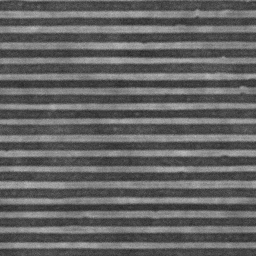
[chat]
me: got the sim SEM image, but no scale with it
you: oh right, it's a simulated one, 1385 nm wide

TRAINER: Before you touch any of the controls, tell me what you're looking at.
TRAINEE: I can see parallel lines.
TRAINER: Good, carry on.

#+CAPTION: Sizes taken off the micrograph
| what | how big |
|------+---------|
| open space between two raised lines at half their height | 53.4 nm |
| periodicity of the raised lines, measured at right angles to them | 0.0833 micrometres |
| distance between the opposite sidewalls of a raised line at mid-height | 29.1 nm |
